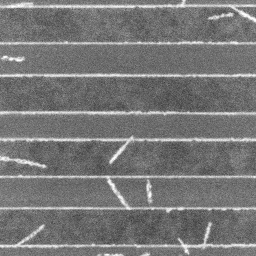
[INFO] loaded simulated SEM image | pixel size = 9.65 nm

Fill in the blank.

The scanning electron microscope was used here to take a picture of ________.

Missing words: lines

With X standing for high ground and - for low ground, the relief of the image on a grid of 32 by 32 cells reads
XXXXXXXXXXXXXXXXXXXXXXXXXXXXXXXX
--------------------------------
--------------------------------
--------------------------------
--------------------------------
XXXXXXXXXXXXXXXXXXXXXXXXXXXXXXXX
XXXXXXXXXXXXXXXXXXXXXXXXXXXXXXXX
XXXXXXXXXXXXXXXXXXXXXXXXXXXXXXXX
XXXXXXXXXXXXXXXXXXXXXXXXXXXXXXXX
--------------------------------
--------------------------------
--------------------------------
--------------------------------
--------------------------------
XXXXXXXXXXXXXXXXXXXXXXXXXXXXXXXX
XXXXXXXXXXXXXXXXXXXXXXXXXXXXXXXX
XXXXXXXXXXXXXXXXXXXXXXXXXXXXXXXX
---------------XX--XX-XX-----XX-
--------------------------------
--------------------------------
--------------------------------
--------------------------------
XXXXXXXXXXXXXXXXXXXXXXXXXXXXXXXX
XXXXXXXXXXXXXXXXXXXXXXXXXXXXXXXX
XXXXXXXXXXXXXXXXXXXXXXXXXXXXXXXX
XXXXXXXXXXXXXXXXXXXXXXXXXXXXXXXX
--------------------------------
--------------------------------
--------------------------------
--------------------------------
--X-----------------------------
XXXXXXXXXXXXXXXXXXXXXXXXXXXXXXXX